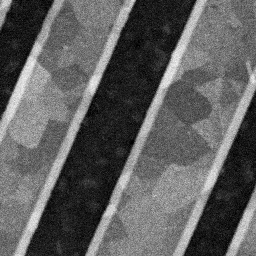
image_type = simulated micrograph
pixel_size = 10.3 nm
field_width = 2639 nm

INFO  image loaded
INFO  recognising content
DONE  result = one or a few lines or trenches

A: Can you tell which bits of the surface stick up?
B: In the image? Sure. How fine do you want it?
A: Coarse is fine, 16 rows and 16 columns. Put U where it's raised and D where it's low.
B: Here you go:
DDDDUUUUDDDDUUUU
DDDUUUUDDDDDUUUU
DDDUUUUDDDDDUUUU
DDUUUUUDDDDUUUUU
DDUUUUDDDDDUUUUU
DUUUUUDDDDUUUUUU
DUUUUDDDDDUUUUUD
UUUUUDDDDUUUUUUD
UUUUDDDDDUUUUUDD
UUUUDDDDDUUUUUDD
UUUUDDDDUUUUUDDD
UUUDDDDDUUUUUDDD
UUUDDDDUUUUUUDDD
UUDDDDDUUUUUDDDU
UUDDDDUUUUUUDDDU
UDDDDDUUUUUDDDDU